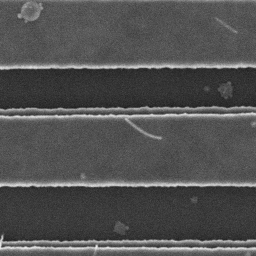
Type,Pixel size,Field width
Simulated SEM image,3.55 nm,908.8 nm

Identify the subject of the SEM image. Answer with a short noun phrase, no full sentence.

lines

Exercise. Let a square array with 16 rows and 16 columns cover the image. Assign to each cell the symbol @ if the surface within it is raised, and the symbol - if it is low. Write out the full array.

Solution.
@@@@@@@@@@@@@@@@
@@@@@@@@@@@@@@@@
@@@@@@@@@@@@@@@@
@@@@@@@@@@@@@@@@
----------------
----------------
----------------
@@@@@@@@@@@@@@@@
@@@@@@@@@@@@@@@@
@@@@@@@@@@@@@@@@
@@@@@@@@@@@@@@@@
@@@@@@@@@@@@@@@@
----------------
----------------
----------------
@@@@@@@@@@@@@@@@